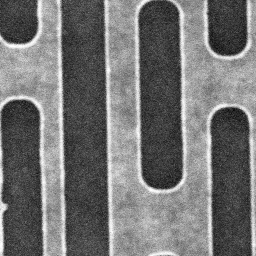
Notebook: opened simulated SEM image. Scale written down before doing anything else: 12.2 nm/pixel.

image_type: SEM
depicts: one or a few lines or trenches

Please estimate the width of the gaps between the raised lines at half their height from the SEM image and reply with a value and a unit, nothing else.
547 nanometers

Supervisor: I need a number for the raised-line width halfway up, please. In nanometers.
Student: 307